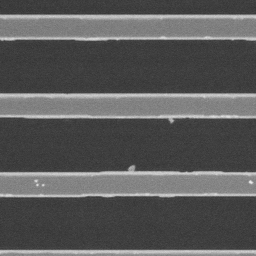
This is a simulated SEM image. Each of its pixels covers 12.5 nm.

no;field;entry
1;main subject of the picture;lines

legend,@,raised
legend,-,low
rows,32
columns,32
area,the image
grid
--------------------------------
--------------------------------
@@@@@@@@@@@@@@@@@@@@@@@@@@@@@@@@
@@@@@@@@@@@@@@@@@@@@@@@@@@@@@@@@
@@@@@@@@@@@@@@@@@@@@@@@@@@@@@@@@
--------------------------------
--------------------------------
--------------------------------
--------------------------------
--------------------------------
--------------------------------
--------------------------------
@@@@@@@@@@@@@@@@@@@@@@@@@@@@@@@@
@@@@@@@@@@@@@@@@@@@@@@@@@@@@@@@@
@@@@@@@@@@@@@@@@@@@@@@@@@@@@@@@@
--------------------------------
--------------------------------
--------------------------------
--------------------------------
--------------------------------
--------------------------------
-------------@@---------@@@-----
@@@@@@@@@@@@@@@@@@@@@@@@@@@@@@@@
@@@@@@@@@@@@@@@@@@@@@@@@@@@@@@@@
-@@@@@@@@@@---------------------
--------------------------------
--------------------------------
--------------------------------
--------------------------------
--------------------------------
--------------------------------
@@@@@@@@@@@@@@@@@@@@@@@@@@@@@@@@